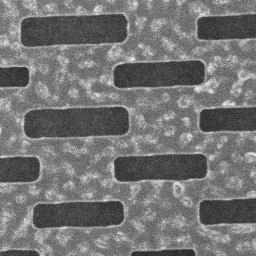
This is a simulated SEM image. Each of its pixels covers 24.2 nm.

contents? holes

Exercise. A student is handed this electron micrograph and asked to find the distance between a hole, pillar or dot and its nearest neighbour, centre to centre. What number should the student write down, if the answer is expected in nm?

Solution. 2240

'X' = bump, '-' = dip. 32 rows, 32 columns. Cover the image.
XXXXXXXXXXXXXXXXXXXXXXXXXXXXXXXX
XXXXXXXXXXXXXXXXXXXXXXXXXXXXXXXX
XXX-------------XXXXXXXXX-------
XX--------------XXXXXXXXX-------
XXX-------------XXXXXXXXX-------
XXX---------XXXXXXXXXXXXXXXXXXXX
XXXXXXXXXXXXXXXXXXXXXXXXXXXXXXXX
XXXXXXXXXXXXXXXXXXXXXXXX-XXXXXXX
---XXXXXXXXXXX------------XXXXXX
----XXXXXXXXXX------------XXXXXX
---XXXXXXXXXXX-----------XXXXXXX
XXXXXXXXXXXXXXXXXXXXXXXXXXXXXXXX
XXXXXXXXXXXXXXXXXXXXXXXXXXXXXXXX
XXXXXXXX--------XXXXXXXXXXX-----
XXX-------------XXXXXXXXX-------
XXX-------------XXXXXXXXX-------
XXX-------------XXXXXXXXXX-XXXXX
XXXXXXXXXXXXXXXXXXXXXXXXXXXXXXXX
XXXXXXXXXXXXXXXXXXXXXXXXXXXXXXXX
XX--XXXXXXXXXXX-----------XXXXXX
-----XXXXXXXXX------------XXXXXX
-----XXXXXXXXX------------XXXXXX
----XXXXXXXXXXX--------XXXXXXXXX
XXXXXXXXXXXXXXXXXXXXXXXXXXXXXXXX
XXXXXXXXXXXXXXXXXXXXXXXXXXXXXXXX
XXXXX----------XXXXXXXXXX-------
XXXX------------XXXXXXXXX-------
XXXX-----------XXXXXXXXXX-------
XXXXX--XXXXXXXXXXXXXXXXXXXXXXXXX
XXXXXXXXXXXXXXXXXXXXXXXXXXXXXXXX
XXXXXXXXXXXXXXXXXXXXXXXXXXXXXXXX
-----XXXXXXXXXXXX-------XXXXXXXX